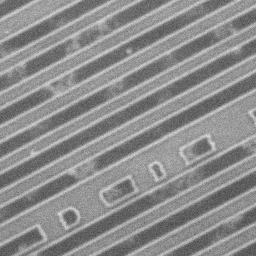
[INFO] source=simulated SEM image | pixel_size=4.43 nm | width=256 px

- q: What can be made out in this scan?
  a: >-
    parallel lines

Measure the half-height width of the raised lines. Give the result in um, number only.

0.0768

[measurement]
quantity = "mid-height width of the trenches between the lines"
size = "52.8 nm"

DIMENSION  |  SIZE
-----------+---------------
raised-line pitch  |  130 nanometres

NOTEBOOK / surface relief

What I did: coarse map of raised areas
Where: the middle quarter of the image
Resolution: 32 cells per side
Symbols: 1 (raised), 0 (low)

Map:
00001111111110000001111111110000
00111111111000000111111111000000
11111111100000001111111110000001
11111110000000111111111000000111
11111000000011111111100000011111
11100000001111111110000001111111
10000000111111111000000111111111
00000001111111100000011111111100
00001111111110000001111111110000
00011111111000000111111111000000
01111111100000001111111100000001
11111111000000111111110000000111
11111100000011111111000000011111
11110000001111111100000001111111
11000000111111111000000011111111
00000011111111100000001111111110
00001111111110000000111111111000
00111111111000000011111111100000
01111111100000001111111110000000
11111110000000111111111000000000
11111000000011111111100000000011
11100000001111111110000000000111
11000000011111111100000000000111
00000001111111110000000000000011
00000111111111000000000000000001
00011111111100000000011100000000
01111111110000000000001110000000
11111111000000000000001110000011
11111100000000011000000100001111
11110000000001111000000000111111
11100000000011111100000011111111
10000000001111111100001111111110